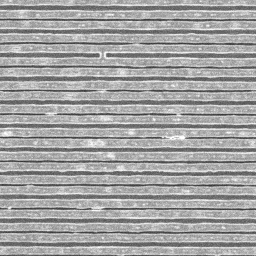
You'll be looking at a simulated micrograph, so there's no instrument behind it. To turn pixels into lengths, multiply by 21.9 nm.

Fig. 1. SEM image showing parallel lines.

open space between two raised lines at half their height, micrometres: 0.107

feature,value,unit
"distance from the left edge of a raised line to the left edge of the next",259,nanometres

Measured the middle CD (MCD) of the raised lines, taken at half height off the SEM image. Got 172 nanometres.